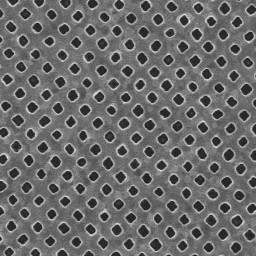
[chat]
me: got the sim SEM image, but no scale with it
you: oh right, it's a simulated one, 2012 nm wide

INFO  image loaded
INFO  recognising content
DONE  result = a regular array of holes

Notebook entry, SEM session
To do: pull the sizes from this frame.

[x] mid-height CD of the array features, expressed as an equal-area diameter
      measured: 76.3 nm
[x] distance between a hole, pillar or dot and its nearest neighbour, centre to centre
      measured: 0.143 um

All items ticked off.